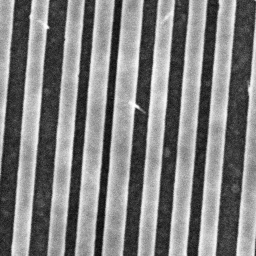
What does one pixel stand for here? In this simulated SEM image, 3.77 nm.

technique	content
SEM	parallel lines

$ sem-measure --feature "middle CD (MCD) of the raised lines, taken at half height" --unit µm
0.0596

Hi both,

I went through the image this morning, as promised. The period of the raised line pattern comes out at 0.117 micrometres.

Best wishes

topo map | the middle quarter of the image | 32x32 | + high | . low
++++...++++...++++....++++....++
++++...++++...++++....++++....++
+++....++++..+++++....++++....++
+++....++++..+++++....++++....++
+++....++++..+++++....++++....++
+++...+++++..+++++....++++....++
+++...+++++..+++++....++++....++
+++...+++++..+++++....++++....++
+++...++++...+++++....++++....++
+++...++++...+++++....+++.....++
+++...++++...+++++....+++.....++
+++...++++...++++.....+++....+++
+++...++++...++++....++++....+++
+++...++++...++++....++++....+++
+++...++++..+++++....++++....+++
++....++++..+++++....++++....+++
++....++++..+++++....++++....+++
++...+++++..+++++....++++....+++
++...+++++..+++++....++++....+++
++...+++++..+++++....++++....+++
++...++++...+++++....+++.....+++
++...++++...+++++....+++.....+++
++...++++...+++++....+++.....+++
++...++++...++++.....+++....++++
++...++++...++++....++++....++++
++...++++...++++....++++....++++
++...++++..+++++....++++....++++
+....++++..+++++....++++....++++
+....++++..+++++....++++....++++
+...+++++..+++++....++++....++++
+...+++++..+++++....++++....++++
+...+++++..+++++....++++....++++